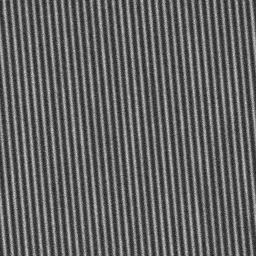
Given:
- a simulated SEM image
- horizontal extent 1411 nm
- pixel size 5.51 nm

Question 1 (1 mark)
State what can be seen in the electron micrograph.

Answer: parallel lines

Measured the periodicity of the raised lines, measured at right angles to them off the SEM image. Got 39.8 nm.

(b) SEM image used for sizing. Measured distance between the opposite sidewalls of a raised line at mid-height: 11 nm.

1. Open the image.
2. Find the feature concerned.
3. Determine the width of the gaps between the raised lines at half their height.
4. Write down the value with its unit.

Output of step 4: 26.8 nanometres